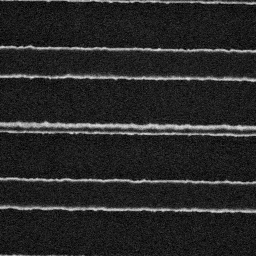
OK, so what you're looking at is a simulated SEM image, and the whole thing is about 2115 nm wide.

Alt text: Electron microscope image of lines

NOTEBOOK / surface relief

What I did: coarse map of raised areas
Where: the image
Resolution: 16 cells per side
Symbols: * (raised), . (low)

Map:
................
................
................
****************
****************
................
................
................
...............*
................
................
****************
****************
................
................
................